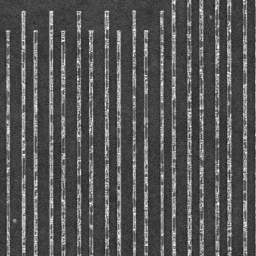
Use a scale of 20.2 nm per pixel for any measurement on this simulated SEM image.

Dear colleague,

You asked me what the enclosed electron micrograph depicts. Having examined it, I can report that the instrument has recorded parallel lines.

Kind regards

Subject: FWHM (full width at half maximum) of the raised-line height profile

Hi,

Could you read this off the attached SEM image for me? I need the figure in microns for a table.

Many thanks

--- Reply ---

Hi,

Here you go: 0.058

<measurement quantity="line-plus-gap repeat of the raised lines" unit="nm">281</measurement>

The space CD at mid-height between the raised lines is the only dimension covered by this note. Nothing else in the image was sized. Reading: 189 nm